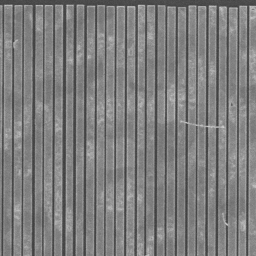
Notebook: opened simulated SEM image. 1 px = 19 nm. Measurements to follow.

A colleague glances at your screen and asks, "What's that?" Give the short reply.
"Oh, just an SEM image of parallel lines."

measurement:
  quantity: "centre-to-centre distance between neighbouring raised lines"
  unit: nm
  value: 194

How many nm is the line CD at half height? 143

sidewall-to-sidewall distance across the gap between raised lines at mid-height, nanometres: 47.5